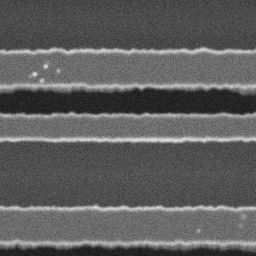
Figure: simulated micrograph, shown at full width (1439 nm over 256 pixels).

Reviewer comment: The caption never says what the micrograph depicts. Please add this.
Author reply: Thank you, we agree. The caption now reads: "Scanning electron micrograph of lines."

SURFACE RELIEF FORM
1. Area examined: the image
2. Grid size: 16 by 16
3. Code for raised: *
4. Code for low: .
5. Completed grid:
................
................
................
****************
****************
*..............*
................
****************
****************
................
................
................
................
****************
****************
................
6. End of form